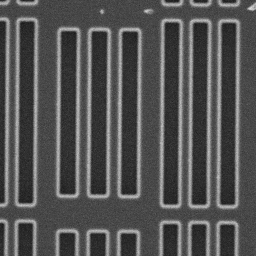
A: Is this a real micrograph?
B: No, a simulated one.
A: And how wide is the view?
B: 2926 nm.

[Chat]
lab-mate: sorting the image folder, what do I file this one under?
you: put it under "groups of lines, slits or small figures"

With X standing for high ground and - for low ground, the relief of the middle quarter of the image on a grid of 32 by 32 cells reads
---XXX-----XXX-----XXXXXX----XXX
---XXX-----XXX-----XXXXXX----XXX
---XXX-----XXX-----XXXXXX----XXX
---XXX-----XXX-----XXXXXX----XXX
---XXX-----XXX-----XXXXXX----XXX
---XXX-----XXX-----XXXXXX----XXX
---XXX-----XXX-----XXXXXX----XXX
---XXX-----XXX-----XXXXXX----XXX
---XXX-----XXX-----XXXXXX----XXX
---XXX-----XXX-----XXXXXX----XXX
---XXX-----XXX-----XXXXXX----XXX
---XXX-----XXX-----XXXXXX----XXX
---XXX-----XXX-----XXXXXX----XXX
---XXX-----XXX-----XXXXXX----XXX
---XXX-----XXX-----XXXXXX----XXX
---XXX-----XXX-----XXXXXX----XXX
---XXX-----XXX-----XXXXXX----XXX
---XXX-----XXX-----XXXXXX----XXX
---XXX-----XXX-----XXXXXX----XXX
---XXX-----XXX-----XXXXX-----XXX
---XXX-----XXX-----XXXXX-----XXX
---XXX-----XXX-----XXXXX-----XXX
---XXX-----XXX-----XXXXX-----XXX
---XXX-----XXX-----XXXXX-----XXX
---XXX-----XXX-----XXXXX-----XXX
---XXX-----XXX-----XXXXX-----XXX
---XXX-----XXX-----XXXXX-----XXX
---XXX-----XXX-----XXXXX-----XXX
---XXX-----XXX-----XXXXX-----XXX
---XXX-----XXX-----XXXXX-----XXX
---XXX-----XXX-----XXXXX-----XXX
---XXX-----XXX-----XXXXX-----XXX